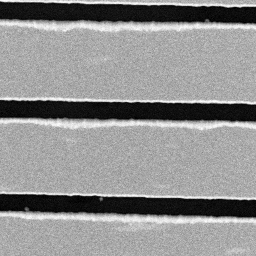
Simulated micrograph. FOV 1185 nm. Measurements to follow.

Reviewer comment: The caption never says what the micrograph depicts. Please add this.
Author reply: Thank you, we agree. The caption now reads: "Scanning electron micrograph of lines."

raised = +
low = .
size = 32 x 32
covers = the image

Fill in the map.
...............+++++++++++++++++
................................
................................
++++++++++++++++++++++++++++++++
++++++++++++++++++++++++++++++++
++++++++++++++++++++++++++++++++
++++++++++++++++++++++++++++++++
++++++++++++++++++++++++++++++++
++++++++++++++++++++++++++++++++
++++++++++++++++++++++++++++++++
++++++++++++++++++++++++++++++++
++++++++++++++++++++++++++++++++
.+++++++++++++++++++++++++++++++
................................
................................
++++++++++++++++++++++++++++++++
++++++++++++++++++++++++++++++++
++++++++++++++++++++++++++++++++
++++++++++++++++++++++++++++++++
++++++++++++++++++++++++++++++++
++++++++++++++++++++++++++++++++
++++++++++++++++++++++++++++++++
++++++++++++++++++++++++++++++++
++++++++++++++++++++++++++++++++
............++++++++++++++++++++
................................
++..............................
++++++++++++++++++++++++++++++++
++++++++++++++++++++++++++++++++
++++++++++++++++++++++++++++++++
++++++++++++++++++++++++++++++++
++++++++++++++++++++++++++++++++